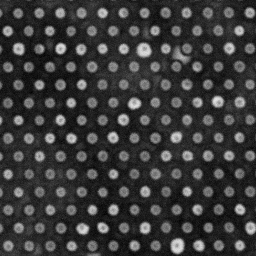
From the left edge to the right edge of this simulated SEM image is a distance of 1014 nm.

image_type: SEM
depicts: a regular array of raised bodies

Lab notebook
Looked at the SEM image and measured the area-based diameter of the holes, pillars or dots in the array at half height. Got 9.32 px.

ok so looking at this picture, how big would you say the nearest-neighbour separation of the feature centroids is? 80.8 nanometers